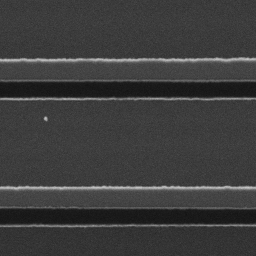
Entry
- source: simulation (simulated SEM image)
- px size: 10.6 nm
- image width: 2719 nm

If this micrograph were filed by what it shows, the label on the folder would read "lines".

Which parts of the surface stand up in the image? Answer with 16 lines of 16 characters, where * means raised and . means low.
................
................
................
................
****************
****************
................
................
................
................
................
................
****************
****************
................
................